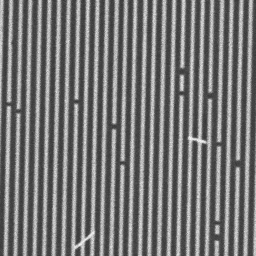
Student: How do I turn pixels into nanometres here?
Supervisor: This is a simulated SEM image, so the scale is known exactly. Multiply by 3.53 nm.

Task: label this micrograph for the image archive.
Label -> parallel lines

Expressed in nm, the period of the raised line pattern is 33.9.